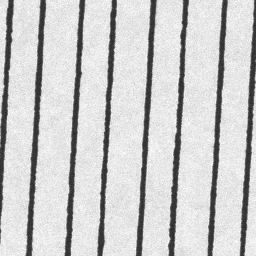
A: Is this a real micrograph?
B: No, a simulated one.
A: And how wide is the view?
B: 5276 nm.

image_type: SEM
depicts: parallel lines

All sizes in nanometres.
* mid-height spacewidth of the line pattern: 527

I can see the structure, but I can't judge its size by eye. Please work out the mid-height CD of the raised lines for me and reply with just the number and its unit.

0.152 um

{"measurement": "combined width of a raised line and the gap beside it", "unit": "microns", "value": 0.732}